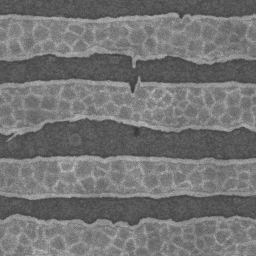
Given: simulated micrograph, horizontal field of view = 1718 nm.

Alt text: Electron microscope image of one or a few lines or trenches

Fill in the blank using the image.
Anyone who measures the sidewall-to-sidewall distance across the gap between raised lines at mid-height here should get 187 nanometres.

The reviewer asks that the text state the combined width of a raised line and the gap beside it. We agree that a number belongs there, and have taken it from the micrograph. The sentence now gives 469 nm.